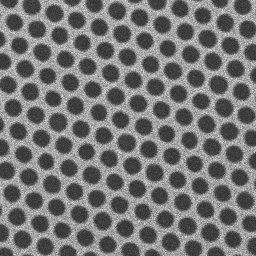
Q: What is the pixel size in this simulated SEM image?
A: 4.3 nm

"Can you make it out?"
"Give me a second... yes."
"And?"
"a regular array of holes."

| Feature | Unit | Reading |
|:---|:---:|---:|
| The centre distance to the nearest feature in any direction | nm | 100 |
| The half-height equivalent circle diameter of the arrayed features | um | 0.0783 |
